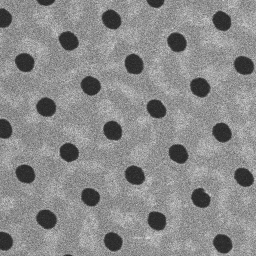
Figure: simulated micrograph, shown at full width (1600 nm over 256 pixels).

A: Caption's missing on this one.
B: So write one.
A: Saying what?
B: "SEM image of a regular array of holes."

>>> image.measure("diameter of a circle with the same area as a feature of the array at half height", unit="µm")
0.117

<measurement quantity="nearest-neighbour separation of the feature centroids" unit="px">48.6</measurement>